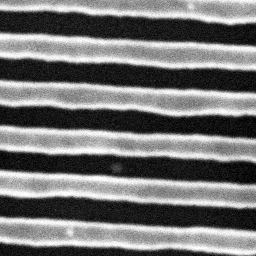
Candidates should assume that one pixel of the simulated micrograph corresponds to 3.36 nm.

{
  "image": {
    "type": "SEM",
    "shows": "lines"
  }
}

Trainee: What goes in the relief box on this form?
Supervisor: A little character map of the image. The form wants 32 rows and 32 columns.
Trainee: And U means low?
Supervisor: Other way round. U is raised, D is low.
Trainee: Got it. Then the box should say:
UUUUUUUUUUUUUUUUUUUUUUUUUUUUUUUU
DDDDDDDDDDUUUUUUUUUUUUUUUUUUUUUU
DDDDDDDDDDDDDDDDDDDDDDDDDUUUUUUU
DDDDDDDDDDDDDDDDDDDDDDDDDDDDDDDD
UUUUUUUDDDDDDDDDDDDDDDDDDDDDDDDD
UUUUUUUUUUUUUUUUUUUUUUUUUUDDDDDD
UUUUUUUUUUUUUUUUUUUUUUUUUUUUUUUU
DDDDDDUDUUUUUUUUUUUUUUUUUUUUUUUU
DDDDDDDDDDDDDDDDDDDDDUUUDDDUUUUU
DDDDDDDDDDDDDDDDDDDDDDDDDDDDDDDD
UUUUUUUUUDDDDDDDDDDDDDDDDDDDDDDD
UUUUUUUUUUUUUUUUUUUUUUUUUUUUDDDD
UUUUUUUUUUUUUUUUUUUUUUUUUUUUUUUU
DDDDDDDDUUDUDUUUUUUUUUUUUUUUUUUU
DDDDDDDDDDDDDDDDDDDDDDDDDDDDDDDD
DDDDDDDDDDDDDDDDDDDDDDDDDDDDDDDD
UUUUUUUUUUUUUUDDDDDDDDDDDDDDDDDD
UUUUUUUUUUUUUUUUUUUUUUUUUUUUUUUU
UUUUUUUUUUUUUUUUUUUUUUUUUUUUUUUU
DDDDDDDDDDDDDDDDDUUDDUUUUUUUUUUU
DDDDDDDDDDDDDDDDDDDDDDDDDDDDDDDD
UUDDDDDDDDDDDDDDDDDDDDDDDDDDDDDD
UUUUUUUUUUUUUUUUUUUUDDDDDDDDDDDD
UUUUUUUUUUUUUUUUUUUUUUUUUUUUUUUU
DUUUUUUUUUUUUUUUUUUUUUUUUUUUUUUU
DDDDDDDDDDDDDDDDDDDDDUUUUUUUUUUU
DDDDDDDDDDDDDDDDDDDDDDDDDDDDDDDD
UUUUUUDDDDDDDDDDDDDDDDDDDDDDDDDD
UUUUUUUUUUUUUUUUUUUUUUDDUUDDDDDD
UUUUUUUUUUUUUUUUUUUUUUUUUUUUUUUU
DDDUUUUUUUUUUUUUUUUUUUUUUUUUUUUU
DDDDDDDDDDDDDDDDDDDDDDDDDDDUUUUU